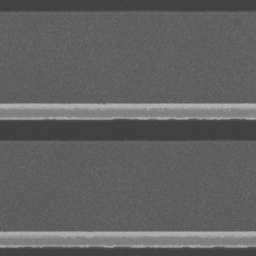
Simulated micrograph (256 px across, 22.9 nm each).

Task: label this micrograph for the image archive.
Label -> lines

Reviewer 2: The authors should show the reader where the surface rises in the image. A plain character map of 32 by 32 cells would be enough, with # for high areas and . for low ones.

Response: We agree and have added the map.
................................
................................
################################
################################
################################
################################
################################
################################
################################
################################
################################
################################
################################
################################
################################
................................
................................
................................
################################
################################
################################
################################
################################
################################
################################
################################
################################
################################
################################
################################
################################
................................